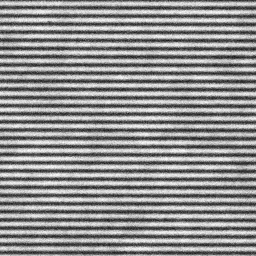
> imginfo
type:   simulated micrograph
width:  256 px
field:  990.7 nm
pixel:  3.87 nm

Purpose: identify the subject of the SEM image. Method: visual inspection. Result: parallel lines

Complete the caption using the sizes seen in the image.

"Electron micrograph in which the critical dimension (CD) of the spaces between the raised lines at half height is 17.4 nm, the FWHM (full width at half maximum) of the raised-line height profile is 13.5 nm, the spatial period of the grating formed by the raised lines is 31.6 nm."